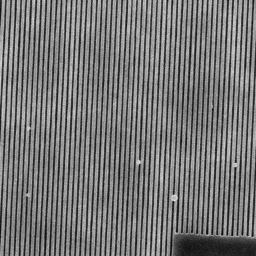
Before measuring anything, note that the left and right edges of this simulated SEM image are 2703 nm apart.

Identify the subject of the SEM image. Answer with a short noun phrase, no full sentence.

parallel lines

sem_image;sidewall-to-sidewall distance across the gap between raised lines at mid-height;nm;26.4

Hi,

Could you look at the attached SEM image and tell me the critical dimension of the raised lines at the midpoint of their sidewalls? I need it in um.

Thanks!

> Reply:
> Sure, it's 0.0264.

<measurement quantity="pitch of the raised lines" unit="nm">53.2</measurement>